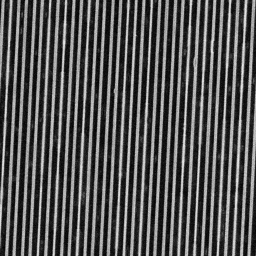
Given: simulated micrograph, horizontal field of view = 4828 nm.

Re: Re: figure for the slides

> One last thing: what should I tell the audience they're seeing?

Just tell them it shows parallel lines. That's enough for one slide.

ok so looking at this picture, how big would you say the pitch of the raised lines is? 7.82 px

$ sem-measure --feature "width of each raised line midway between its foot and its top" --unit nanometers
51.8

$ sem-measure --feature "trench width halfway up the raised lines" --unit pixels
5.62